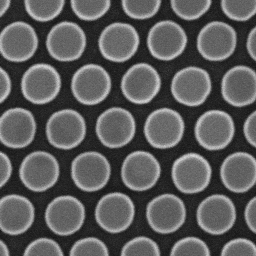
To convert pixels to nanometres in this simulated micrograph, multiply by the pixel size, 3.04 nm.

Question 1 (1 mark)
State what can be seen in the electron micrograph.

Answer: a regular array of raised bodies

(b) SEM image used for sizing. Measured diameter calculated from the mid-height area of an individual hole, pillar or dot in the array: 0.114 µm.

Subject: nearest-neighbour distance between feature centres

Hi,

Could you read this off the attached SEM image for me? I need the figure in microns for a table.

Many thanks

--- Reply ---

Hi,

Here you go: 0.147